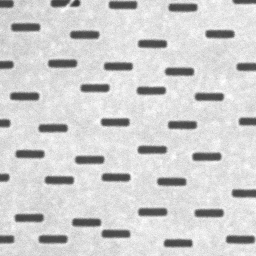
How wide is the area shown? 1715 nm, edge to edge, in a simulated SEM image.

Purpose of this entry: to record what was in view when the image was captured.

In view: a regular array of holes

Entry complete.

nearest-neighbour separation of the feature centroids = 245 nanometres